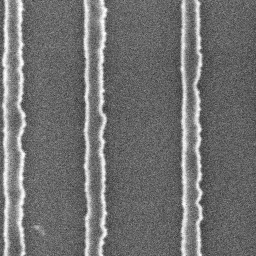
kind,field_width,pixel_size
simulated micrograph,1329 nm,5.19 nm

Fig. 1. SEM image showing lines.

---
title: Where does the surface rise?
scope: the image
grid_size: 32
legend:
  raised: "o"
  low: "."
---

.oo........oo..........oo.......
.oo........oo..........oo.......
.oo........oo..........oo.......
.oo........oo..........oo.......
.oo........oo..........oo.......
.oo........oo..........oo.......
.oo........oo..........oo.......
ooo........oo..........oo.......
.oo........oo..........oo.......
.oo........oo..........oo.......
.oo........oo..........oo.......
.oo........oo..........oo.......
.oo........oo..........oo.......
.oo........oo..........oo.......
.oo........oo..........oo.......
.oo........oo..........oo.......
.oo........oo..........oo.......
.o.........oo..........oo.......
.oo........oo..........oo.......
.oo........oo..........oo.......
.oo........oo..........oo.......
.oo........oo..........oo.......
.oo........oo..........oo.......
.oo........oo..........oo.......
.oo........oo..........oo.......
.oo........oo..........oo.......
.oo........oo..........oo.......
.oo........oo..........oo.......
.oo........oo..........oo.......
.oo........oo..........oo.......
.oo........oo..........oo.......
.oo........oo..........oo.......